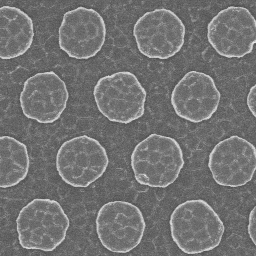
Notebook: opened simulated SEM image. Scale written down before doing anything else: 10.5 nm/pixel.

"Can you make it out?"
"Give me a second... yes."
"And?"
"a regular array of raised bodies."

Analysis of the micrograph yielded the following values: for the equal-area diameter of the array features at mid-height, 521 nm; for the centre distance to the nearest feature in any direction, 0.777 micrometres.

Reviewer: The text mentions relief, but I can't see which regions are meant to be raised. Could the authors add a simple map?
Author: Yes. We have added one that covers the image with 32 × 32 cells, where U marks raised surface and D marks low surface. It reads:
DDDDDDDDDDDDDDDDDDDDDDDDDDDDDDDD
UUUDDDDDDUUUDDDDDDDUUDDDDDDDUUUD
UUUUDDDDUUUUUDDDDUUUUUDDDDDUUUUU
UUUUDDDUUUUUUDDDDUUUUUUDDDUUUUUU
UUUUDDDUUUUUUDDDDUUUUUUDDDUUUUUU
UUUUDDDUUUUUUDDDDUUUUUUDDDUUUUUU
UUUDDDDDUUUUDDDDDDUUUUDDDDDUUUUD
DDDDDDDDDDDDDDDDDDDDDDDDDDDDDDDD
DDDDDDDDDDDDDDDDDDDDDDDDDDDDDDDD
DDDDUUUDDDDDDDUUUDDDDDDUUUDDDDDD
DDDUUUUUDDDDUUUUUDDDDDUUUUUDDDDD
DDDUUUUUDDDDUUUUUUDDDDUUUUUDDDDU
DDDUUUUUDDDDUUUUUUDDDDUUUUUDDDDU
DDDUUUUUDDDDUUUUUUDDDDUUUUUDDDDU
DDDUUUUDDDDDDUUUUDDDDDDUUUDDDDDD
DDDDDDDDDDDDDDDDDDDDDDDDDDDDDDDD
DDDDDDDDDDDDDDDDDDDDDDDDDDDDDDDD
UUDDDDDDDUUUDDDDDDUUUUDDDDDDUUUD
UUUDDDDDUUUUUDDDDUUUUUDDDDDUUUUU
UUUDDDDUUUUUUDDDDUUUUUUDDDUUUUUU
UUUUDDDUUUUUUDDDDUUUUUUDDDUUUUUU
UUUDDDDUUUUUUDDDDUUUUUDDDDDUUUUU
UUUDDDDDUUUUDDDDDUUUUUDDDDDUUUUD
DDDDDDDDDDDDDDDDDDDDDDDDDDDDDDDD
DDDDDDDDDDDDDDDDDDDDDDDDDDDDDDDD
DDDDUUUDDDDDDUUUDDDDDDDUUUDDDDDD
DDDUUUUUDDDDUUUUUDDDDDUUUUUDDDDU
DDUUUUUUDDDDUUUUUUDDDUUUUUUUDDDU
DDUUUUUUDDDDUUUUUUDDDUUUUUUUDDDU
DDUUUUUUDDDDUUUUUUDDDDUUUUUUDDDU
DDDUUUUDDDDDDUUUUDDDDDUUUUUDDDDD
DDDDDDDDDDDDDDUUDDDDDDDUUDDDDDDD